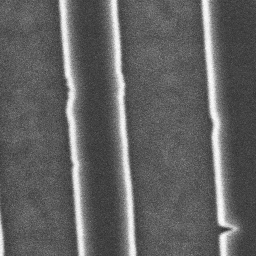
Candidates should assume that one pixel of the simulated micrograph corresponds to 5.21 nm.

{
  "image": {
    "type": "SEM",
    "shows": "one or a few lines or trenches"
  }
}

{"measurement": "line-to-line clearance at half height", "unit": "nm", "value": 463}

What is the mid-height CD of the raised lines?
275 nanometres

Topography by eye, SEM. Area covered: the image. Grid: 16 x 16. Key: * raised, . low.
....***......***
....***......***
....***......***
....***......***
....***......***
....****.....***
....****.....***
....****.....***
....****.....***
.....***.....***
.....***......**
.....***......**
.....***......**
.....***......**
.....***......**
.....***......**